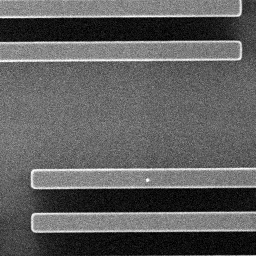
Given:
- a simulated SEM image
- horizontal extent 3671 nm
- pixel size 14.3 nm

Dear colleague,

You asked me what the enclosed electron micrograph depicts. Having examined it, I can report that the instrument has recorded groups of lines, slits or small figures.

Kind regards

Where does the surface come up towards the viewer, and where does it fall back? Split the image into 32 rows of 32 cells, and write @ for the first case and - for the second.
@@@@@@@@@@@@@@@@@@@@@@@@@@@@@@--
@@@@@@@@@@@@@@@@@@@@@@@@@@@@@@--
--------------------------------
--------------------------------
--------------------------------
@@@@@@@@@@@@@@@@@@@@@@@@@@@@@@--
@@@@@@@@@@@@@@@@@@@@@@@@@@@@@@--
@@@@@@@@@@@@@@@@@@@@@-----------
--------------------------------
--------------------------------
--------------------------------
--------------------------------
--------------------------------
--------------------------------
--------------------------------
--------------------------------
--------------------------------
--------------------------------
--------------------------------
--------------------------------
--------------------------------
----@@@@@@@@@@@@@@@@@@@@@@@@@@@@
----@@@@@@@@@@@@@@@@@@@@@@@@@@@@
----@@@@@@@---------------------
--------------------------------
--------------------------------
--------------------------------
----@@@@@@@@@@@@@@@@@@@@@@@@@@@@
----@@@@@@@@@@@@@@@@@@@@@@@@@@@@
--------------------------------
--------------------------------
--------------------------------